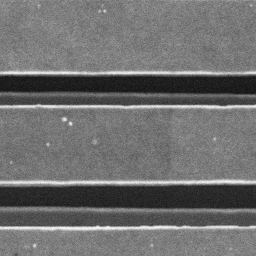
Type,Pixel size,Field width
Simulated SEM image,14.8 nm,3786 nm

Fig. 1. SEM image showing lines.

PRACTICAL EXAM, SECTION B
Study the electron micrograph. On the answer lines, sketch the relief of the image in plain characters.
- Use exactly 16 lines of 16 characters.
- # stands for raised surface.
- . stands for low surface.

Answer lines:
################
################
################
################
################
................
................
################
################
################
################
................
................
................
################
################